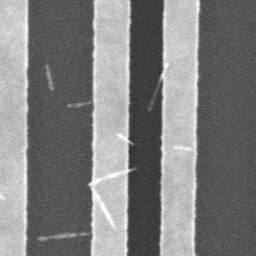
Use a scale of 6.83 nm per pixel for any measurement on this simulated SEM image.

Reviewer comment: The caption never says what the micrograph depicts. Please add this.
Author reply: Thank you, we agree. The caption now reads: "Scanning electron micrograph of lines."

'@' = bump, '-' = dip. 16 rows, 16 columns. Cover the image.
@@----@@--@@----
@@----@@--@@----
@@----@@--@@----
@@----@@--@@----
@@----@@--@@----
@@----@@--@@----
@@----@@--@@----
@@----@@--@@----
@@----@@--@@----
@@----@@--@@----
@@----@@--@@----
@@----@@--@@----
@@----@@--@@----
@@----@@--@@----
@@----@@--@@----
@@----@@--@@----